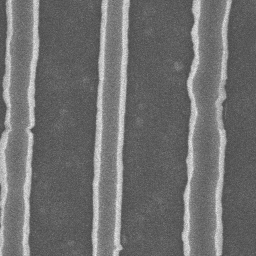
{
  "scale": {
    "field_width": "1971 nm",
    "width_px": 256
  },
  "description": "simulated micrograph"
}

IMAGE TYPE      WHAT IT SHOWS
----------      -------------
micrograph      one or a few lines or trenches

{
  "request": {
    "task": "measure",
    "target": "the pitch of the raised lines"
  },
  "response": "727 nm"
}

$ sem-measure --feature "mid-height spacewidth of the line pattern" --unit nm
516